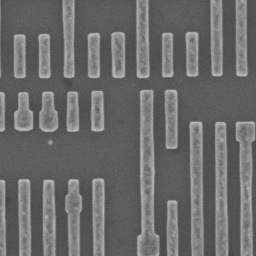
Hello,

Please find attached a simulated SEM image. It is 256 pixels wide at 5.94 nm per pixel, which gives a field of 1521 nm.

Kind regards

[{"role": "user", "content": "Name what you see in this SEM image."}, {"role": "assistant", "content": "wiring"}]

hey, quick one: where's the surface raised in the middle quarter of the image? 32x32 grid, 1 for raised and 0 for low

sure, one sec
11000011100011100011100001100001
11000011100011100011100001100001
11000011100011100011100001100001
00000000000000000000000000000000
00000000000000000000000000000000
00000000000000000000000000000000
00000000000000000000000000000000
01100001110000000001110001110000
01100001110000000001110001110000
01100001110000000001110001110000
01110001110000000001110001110000
01110001010000000001110001110000
01110001110000000001110001110000
01110001110000000001110000110000
01110001110000000001110000110000
01110001110000000001110000110001
01110001110000000001110000110000
00000000000000000001110000110000
00000000000000000001110000110000
00000000000000000001110000110000
00000000000000000001110000110000
00000000000000000001110000000000
00000000000000000001110000000000
00000000000000000001110000000000
00000000000000000001110000000000
00000000000000000001110000000000
00000000000000000001111000000000
00000000000000000001111000000000
00000000000000000001110000000000
01110001110000000001110000000000
01110001110000000001110000000000
01110001110000000001110000000000